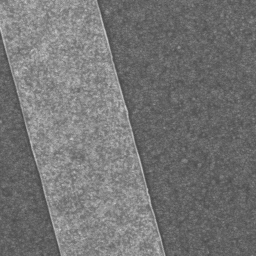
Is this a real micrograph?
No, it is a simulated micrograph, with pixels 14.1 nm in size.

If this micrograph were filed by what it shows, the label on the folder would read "one or a few lines or trenches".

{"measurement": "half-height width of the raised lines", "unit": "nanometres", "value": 1410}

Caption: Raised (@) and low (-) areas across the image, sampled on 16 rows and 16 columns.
@@@@@@----------
@@@@@@----------
@@@@@@@---------
@@@@@@@---------
-@@@@@@---------
-@@@@@@@--------
-@@@@@@@--------
--@@@@@@--------
--@@@@@@--------
--@@@@@@@-------
--@@@@@@@-------
---@@@@@@-------
---@@@@@@-------
---@@@@@@@------
---@@@@@@@------
----@@@@@@------